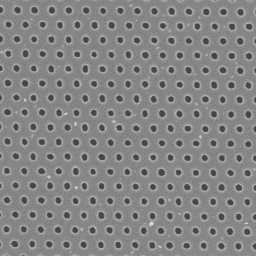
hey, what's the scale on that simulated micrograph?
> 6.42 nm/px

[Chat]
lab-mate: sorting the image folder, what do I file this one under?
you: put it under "a regular array of holes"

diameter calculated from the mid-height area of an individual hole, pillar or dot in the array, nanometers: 41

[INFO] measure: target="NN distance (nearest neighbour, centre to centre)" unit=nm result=107